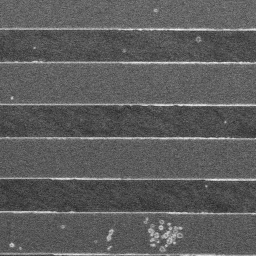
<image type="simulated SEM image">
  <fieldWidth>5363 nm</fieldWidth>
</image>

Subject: lines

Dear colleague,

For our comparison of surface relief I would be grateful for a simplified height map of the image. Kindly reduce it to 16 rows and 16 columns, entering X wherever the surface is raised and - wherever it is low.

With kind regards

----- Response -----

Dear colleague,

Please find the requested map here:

XXXXXXXXXXXXXXXX
XXXXXXXXXXXXXXXX
----------------
----------------
XXXXXXXXXXXXXXXX
XXXXXXXXXXXXXXXX
XXXXXXXXXXXXXXXX
----------------
----------------
XXXXXXXXXXXXXXXX
XXXXXXXXXXXXXXXX
----------------
----------------
XXXXXXXXXXXXXXXX
XXXXXXXXXXXXXXXX
XXXXXXXXXXXXXXXX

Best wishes